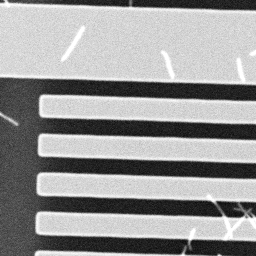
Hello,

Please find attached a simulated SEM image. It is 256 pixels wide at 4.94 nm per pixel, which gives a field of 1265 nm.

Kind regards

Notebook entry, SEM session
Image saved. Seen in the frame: groups of lines, slits or small figures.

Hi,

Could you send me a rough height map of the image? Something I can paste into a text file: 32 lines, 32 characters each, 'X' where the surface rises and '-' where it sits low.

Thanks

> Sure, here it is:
XXX-----------------------------
XXXXXXXXXXXXXXXXXXXXXXXXXXXXXXXX
XXXXXXXXXXXXXXXXXXXXXXXXXXXXXXXX
XXXXXXXXXXXXXXXXXXXXXXXXXXXXXXXX
XXXXXXXXXXXXXXXXXXXXXXXXXXXXXXXX
XXXXXXXXXXXXXXXXXXXXXXXXXXXXXXXX
XXXXXXXXXXXXXXXXXXXXXXXXXXXXXXXX
XXXXXXXXXXXXXXXXXXXXXXXXXXXXXXXX
XXXXXXXXXXXXXXXXXXXXXXXXXXXXXXXX
XXXXXXXXXXXXXXXXXXXXXXXXXXXXXXXX
-----------------------------XXX
--------------------------------
-----XXXXXXXXXXXXXXXXXX---------
-----XXXXXXXXXXXXXXXXXXXXXXXXXXX
-----XXXXXXXXXXXXXXXXXXXXXXXXXXX
--------------------------------
--------------------------------
-----XXXXXXXXXXXXXXXXXXXXXXXXX--
-----XXXXXXXXXXXXXXXXXXXXXXXXXXX
------XXXXXXXXXXXXXXXXXXXXXXXXXX
--------------------------------
--------------------------------
-----XXXXXXXXXXXXXXXXXXXXXXXXXXX
-----XXXXXXXXXXXXXXXXXXXXXXXXXXX
--------XXXXXXXXXXXXXXXXXXXXXXXX
--------------------------------
--------------------------------
-----XXXXXXXXXXXXXXXXXXXXXXXXXXX
-----XXXXXXXXXXXXXXXXXXXXXXXXXXX
--------------XXXXXXXXXXXXXXXXXX
--------------------------------
-----XXXXXX---------------------